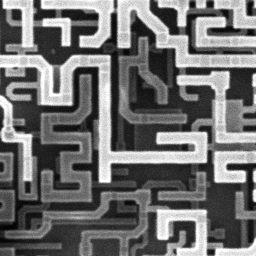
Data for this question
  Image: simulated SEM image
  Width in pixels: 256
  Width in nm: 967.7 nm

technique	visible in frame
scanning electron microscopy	wiring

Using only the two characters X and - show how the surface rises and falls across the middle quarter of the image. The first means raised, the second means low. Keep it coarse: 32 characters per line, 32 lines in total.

XXXXXXXXXXX---XXX-XXX-------XXXX
XX-------XX---XX---XX-----------
XX-------XX---XX---XXX----------
XX--XXX--XX---XX----XXXX----XXXX
XX--XXX--XX---XX-----XXXX---XXXX
XX--XXX--XX---XX------XXXX------
XX--XXX--XX---XX-------XXX------
XX--XXX--XX---XX-------XXX------
XX--XXX--XX---XX--------XX------
XX--XXX--XX---XX--------XX------
----XXX--XX---XX----------------
---XXXX--XX---XXX---------------
XXXXXX---XX---XXXX--------------
XXXXX----XX----XXXXXXXXXXXXXXXX-
XXXX-----XX-----XXXXXXXXXXXXXXX-
---------XX---------------------
---------XX---------------------
XXXXXXX--XX------------XXXXXXXXX
XXXXXXX--XX------------XXXXXXXXX
XXXXXXX--XX------------XXXXXXXXX
----XXX--XX---------------------
----XXX--XX---------------------
XXXXXXX--XXXXXXXXXXXXXXXXXXXXXXX
XXXXXXX--XXXXXXXXXXXXXXXXXXXXXXX
XXXXXXX--XXXXXXXXXXXXXXXXXXXXXXX
XX-------XX---------------------
XX-------XX---------------------
XXXXXXX--XX---------------------
XXXXXXX--XX---------------------
----XXX-------------------------
----XXX-------------------------
----XXX-----------X-------------